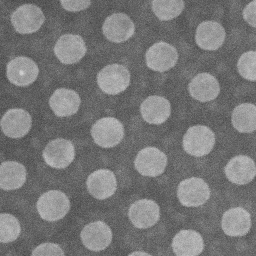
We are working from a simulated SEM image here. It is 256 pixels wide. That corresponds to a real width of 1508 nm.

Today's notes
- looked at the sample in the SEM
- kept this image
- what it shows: a regular array of raised bodies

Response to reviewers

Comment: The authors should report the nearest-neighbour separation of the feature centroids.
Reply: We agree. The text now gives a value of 305 nanometres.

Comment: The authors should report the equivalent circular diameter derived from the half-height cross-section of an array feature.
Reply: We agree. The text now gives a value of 174 nanometres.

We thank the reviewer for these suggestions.